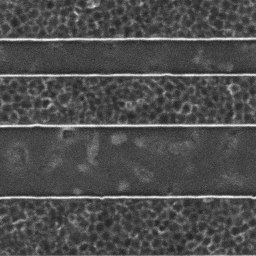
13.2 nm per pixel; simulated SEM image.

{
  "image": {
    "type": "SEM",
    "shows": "one or a few lines or trenches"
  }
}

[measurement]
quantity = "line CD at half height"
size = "670 nanometers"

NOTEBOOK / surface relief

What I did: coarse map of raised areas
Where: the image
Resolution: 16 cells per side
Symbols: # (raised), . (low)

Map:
################
################
................
................
................
################
################
################
................
................
................
................
################
################
################
################